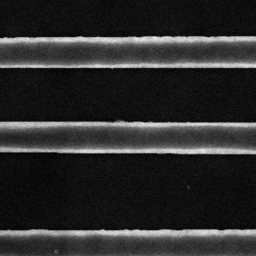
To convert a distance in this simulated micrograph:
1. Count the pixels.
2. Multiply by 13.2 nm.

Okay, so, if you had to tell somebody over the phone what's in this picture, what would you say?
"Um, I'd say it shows lines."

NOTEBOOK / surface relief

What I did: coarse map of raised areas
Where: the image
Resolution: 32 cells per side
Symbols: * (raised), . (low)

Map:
................................
................................
................................
................................
................................
********************************
********************************
********************************
................................
................................
................................
................................
................................
................................
................................
*****************************...
********************************
********************************
********************************
................................
................................
................................
................................
................................
................................
................................
................................
................................
................................
********************************
********************************
********************************